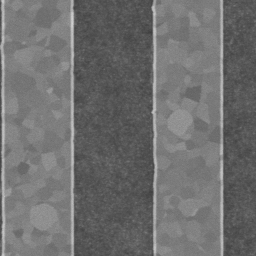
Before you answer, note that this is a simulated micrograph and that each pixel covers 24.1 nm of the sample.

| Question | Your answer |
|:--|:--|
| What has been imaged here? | one or a few lines or trenches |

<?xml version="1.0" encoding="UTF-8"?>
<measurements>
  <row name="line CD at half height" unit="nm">1650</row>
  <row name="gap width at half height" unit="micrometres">1.98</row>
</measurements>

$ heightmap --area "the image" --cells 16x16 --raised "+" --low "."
++++......++++..
++++......++++..
++++......++++..
++++......++++..
++++......++++..
++++......++++..
++++......++++..
++++......++++..
++++......++++..
++++......++++..
++++......++++..
++++......++++..
++++......++++..
++++......++++..
++++......++++..
++++......++++..